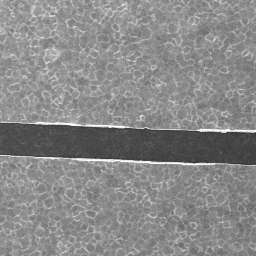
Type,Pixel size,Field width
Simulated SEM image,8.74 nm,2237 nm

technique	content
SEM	one or a few lines or trenches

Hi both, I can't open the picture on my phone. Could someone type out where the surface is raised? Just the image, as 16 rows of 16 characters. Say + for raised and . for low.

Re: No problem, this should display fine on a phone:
++++++++++++++++
++++++++++++++++
++++++++++++++++
++++++++++++++++
++++++++++++++++
++++++++++++++++
++++++++++++++++
++++++++++++++++
................
................
++++++++++++++++
++++++++++++++++
++++++++++++++++
++++++++++++++++
++++++++++++++++
++++++++++++++++